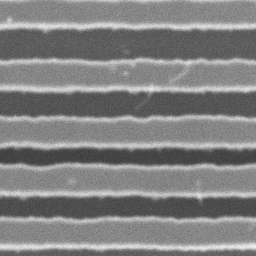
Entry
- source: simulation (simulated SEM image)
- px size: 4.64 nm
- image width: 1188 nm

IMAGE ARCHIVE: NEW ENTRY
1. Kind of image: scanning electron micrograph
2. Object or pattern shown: lines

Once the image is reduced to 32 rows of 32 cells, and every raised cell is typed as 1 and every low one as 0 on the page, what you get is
11111111111111111111111111111111
11111111111111111111111111111111
11111111111111111111111111111111
11000111111000011100011111111110
00000000000000000000000000000000
00000000000000000000000000000000
00000000000000000000000000000000
00001010000000000110000001000100
11111111111111111111111111111111
11111111111111111111111111111111
11111111111111111111111111111111
00000000000000000000000000000000
00000000000000000000000000000000
00000000000000000000000000000000
00000000000000000000000111110000
11111111111111111111111111111111
11111111111111111111111111111111
11111111111111111111111111111111
10001111110011111111001111111111
00000000000000000000000000000000
00000000110000000000000000000000
11111111111111111111111111111111
11111111111111111111111111111111
11111111111111111111111111111111
00000100011100100001111111111111
00000000000000000000000000000000
00000000000000000000000000000000
11111111111111111111111111111111
11111111111111111111111111111111
11111111111111111111111111111111
11111111111111111111111111111111
00000000000000000000000000000000